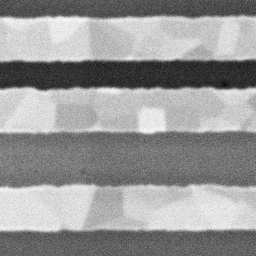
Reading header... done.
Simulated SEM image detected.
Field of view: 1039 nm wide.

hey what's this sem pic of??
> lines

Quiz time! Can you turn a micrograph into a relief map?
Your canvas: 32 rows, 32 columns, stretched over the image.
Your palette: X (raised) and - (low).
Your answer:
--------------------------------
--------------------------------
XXXXXXXXXXXXXXXXXXXXXXXXXXXXXXXX
XXXXXXXXXXXXXXXXXXXXXXXXXXXXXXXX
XXXXXXXXXXXXXXXXXXXXXXXXXXXXXXXX
XXXXXXXXXXXXXXXXXXXXXXXXXXXXXXXX
XXXXXXXXXXXXXXXXXXXXXXXXXXXXXXXX
XX-XXXXXXX-------X--X----X-X----
--------------------------------
--------------------------------
--------------------------------
XXXXXXXXXXXXXXXXXXXXXXXXXXXXXXXX
XXXXXXXXXXXXXXXXXXXXXXXXXXXXXXXX
XXXXXXXXXXXXXXXXXXXXXXXXXXXXXXXX
XXXXXXXXXXXXXXXXXXXXXXXXXXXXXXXX
XXXXXXXXXXXXXXXXXXXXXXXXXXXXXXXX
----XX-----------XX-------------
--------------------------------
--------------------------------
--------------------------------
--------------------------------
--------------------------------
--------------------------------
----XXXXXXXXXXXXXXXXXXXXXXXXXX--
XXXXXXXXXXXXXXXXXXXXXXXXXXXXXXXX
XXXXXXXXXXXXXXXXXXXXXXXXXXXXXXXX
XXXXXXXXXXXXXXXXXXXXXXXXXXXXXXXX
XXXXXXXXXXXXXXXXXXXXXXXXXXXXXXXX
XXXXXXXXXXXXXXXXXXXXXXXXXXXXXXXX
--------------------------------
--------------------------------
--------------------------------